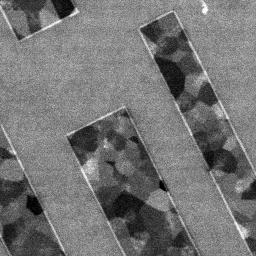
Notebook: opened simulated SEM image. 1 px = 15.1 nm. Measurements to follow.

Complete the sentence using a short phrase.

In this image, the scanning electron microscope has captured one or a few lines or trenches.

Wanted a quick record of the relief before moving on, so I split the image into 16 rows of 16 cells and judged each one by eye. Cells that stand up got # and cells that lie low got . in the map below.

#####...........
.##......##.....
.........###....
..........##....
..........###...
...........##...
...........###..
......##....##..
....#####...###.
#....####....##.
#....#####...###
##....####....##
##....#####...##
###....####....#
###....#####...#
####....####....